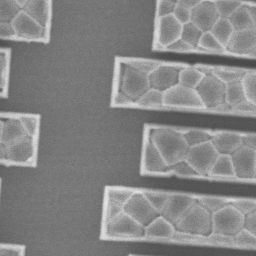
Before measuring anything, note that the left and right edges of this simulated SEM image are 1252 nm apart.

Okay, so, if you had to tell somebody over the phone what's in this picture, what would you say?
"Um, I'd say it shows one or a few lines or trenches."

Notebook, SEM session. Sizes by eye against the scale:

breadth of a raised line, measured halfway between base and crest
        244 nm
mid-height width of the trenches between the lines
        73.1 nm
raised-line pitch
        323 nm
